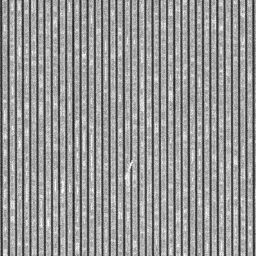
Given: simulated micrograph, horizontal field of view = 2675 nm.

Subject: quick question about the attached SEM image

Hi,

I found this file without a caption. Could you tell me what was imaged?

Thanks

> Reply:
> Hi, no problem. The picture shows parallel lines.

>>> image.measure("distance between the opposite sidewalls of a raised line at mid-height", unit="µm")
0.0523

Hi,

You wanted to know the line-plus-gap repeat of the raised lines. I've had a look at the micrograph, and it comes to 75.3 nanometers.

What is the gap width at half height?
26.1 nanometres